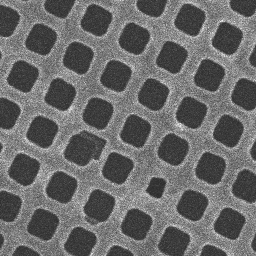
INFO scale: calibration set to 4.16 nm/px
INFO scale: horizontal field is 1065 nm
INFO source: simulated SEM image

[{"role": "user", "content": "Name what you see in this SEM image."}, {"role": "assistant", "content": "a regular array of holes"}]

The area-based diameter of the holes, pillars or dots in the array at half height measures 128 nanometres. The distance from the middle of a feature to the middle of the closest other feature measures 171 nm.